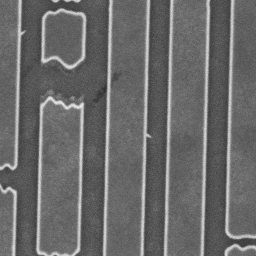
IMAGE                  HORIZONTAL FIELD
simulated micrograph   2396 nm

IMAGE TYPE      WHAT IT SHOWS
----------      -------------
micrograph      one or a few lines or trenches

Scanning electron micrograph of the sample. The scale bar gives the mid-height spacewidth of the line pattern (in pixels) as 24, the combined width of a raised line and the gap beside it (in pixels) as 62.2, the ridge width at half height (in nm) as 352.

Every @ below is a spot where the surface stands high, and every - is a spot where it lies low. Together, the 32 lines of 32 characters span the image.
@@------------@@@@@---@@@@---@@@
@@-----@@-----@@@@@--@@@@@---@@@
@@---@@@@@@---@@@@@--@@@@@---@@@
@@---@@@@@----@@@@---@@@@@---@@@
@@---@@@@@----@@@@---@@@@@---@@@
@@---@@@@@----@@@@---@@@@@---@@@
@@---@@@@@----@@@@---@@@@@---@@@
@@---@-@@@----@@@@---@@@@@---@@@
@@------------@@@@---@@@@@---@@@
@@------------@@@@---@@@@@---@@@
@@------------@@@@---@@@@@---@@@
@@------------@@@@---@@@@@---@@@
@@----@-------@@@@---@@@@@---@@@
@@---@@@@@----@@@@---@@@@@---@@@
@@---@@@@@---@@@@@---@@@@@---@@@
@@---@@@@@---@@@@@---@@@@@---@@@
@@---@@@@@---@@@@@---@@@@@---@@@
@@---@@@@@---@@@@@---@@@@@---@@@
@@---@@@@@---@@@@@---@@@@@---@@@
@@---@@@@@---@@@@@---@@@@@---@@@
@@---@@@@@---@@@@@---@@@@@---@@@
-----@@@@@---@@@@@---@@@@@---@@@
-----@@@@@---@@@@@---@@@@@--@@@@
-----@@@@@---@@@@@---@@@@@--@@@@
@@---@@@@@---@@@@@---@@@@---@@@@
@@---@@@@@---@@@@@---@@@@---@@@@
@@---@@@@@---@@@@@---@@@@---@@@@
@@---@@@@@---@@@@@---@@@@---@@@@
@@---@@@@@---@@@@@---@@@@---@@@@
@@---@@@@@---@@@@@---@@@@----@@@
@@---@@@@@---@@@@@---@@@@-------
@@---@@@@@---@@@@@---@@@@---@@@@